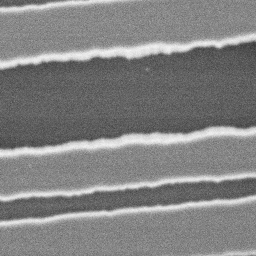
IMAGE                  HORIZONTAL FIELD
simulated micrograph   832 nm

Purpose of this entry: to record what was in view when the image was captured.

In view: lines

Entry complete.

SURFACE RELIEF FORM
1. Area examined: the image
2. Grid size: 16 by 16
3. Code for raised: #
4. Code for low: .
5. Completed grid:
################
################
###############.
#####...........
................
................
................
................
............####
################
################
################
################
################
################
################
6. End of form